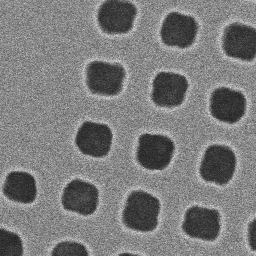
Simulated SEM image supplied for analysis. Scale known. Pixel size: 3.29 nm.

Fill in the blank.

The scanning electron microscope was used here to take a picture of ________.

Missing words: a regular array of holes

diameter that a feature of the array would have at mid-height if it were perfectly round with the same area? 35.7 pixels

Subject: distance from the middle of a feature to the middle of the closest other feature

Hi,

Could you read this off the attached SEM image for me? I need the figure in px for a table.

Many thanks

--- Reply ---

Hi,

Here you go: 60.4